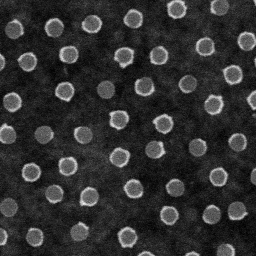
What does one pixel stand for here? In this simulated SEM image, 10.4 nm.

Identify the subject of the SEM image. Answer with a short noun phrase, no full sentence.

a regular array of raised bodies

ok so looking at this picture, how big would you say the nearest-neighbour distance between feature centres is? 0.36 microns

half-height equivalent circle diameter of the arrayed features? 0.193 um